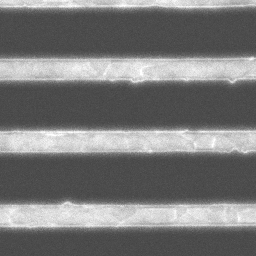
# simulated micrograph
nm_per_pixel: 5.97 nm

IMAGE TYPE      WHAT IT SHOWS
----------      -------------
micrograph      one or a few lines or trenches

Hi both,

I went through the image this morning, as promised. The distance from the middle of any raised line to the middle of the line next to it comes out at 0.434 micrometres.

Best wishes